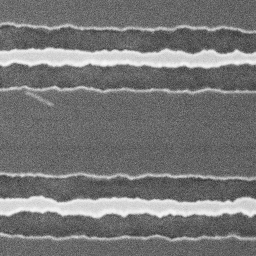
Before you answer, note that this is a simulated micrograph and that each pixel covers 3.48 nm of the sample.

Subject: lines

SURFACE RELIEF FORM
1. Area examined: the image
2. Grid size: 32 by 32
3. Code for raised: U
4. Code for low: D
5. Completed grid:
UUUUUUUUUUUUUUUUUUUUUUUUUUUUUUUU
UUUUUUUUUUUUUUUUUUUUUUUUUUUUUUUU
UUUUUUUUUUUUUUUUUUUUUUUUUUUUUUUU
DDDDDDUDDUUUUUUUUUUUUUDDUUUUUUUU
DDDDDDDDDDDDDDDDDDDDDDDDDDDDDDDD
DDDDDDDDDDDDDDDDDDDDDDDDDDDDDDDD
UUUUUUUUUUUDUUUUUDDDUUUDDUUDDUDD
UUUUUUUUUUUUUUUUUUUUUUUUUUUUUUUU
DDDDDDDDDDDDDDDDDDDDDDDDDDDDDDDD
DDDDDDDDDDDDDDDDDDDDDDDDDDDDDDDD
DDDDDDDDDDDDDDDDDDDDDDDDDDDDDDDD
UUUUUUUUUUUUUUUUUUUUUUUUUUUUUUUU
UUUUUUUUUUUUUUUUUUUUUUUUUUUUUUUU
UUUUUUUUUUUUUUUUUUUUUUUUUUUUUUUU
UUUUUUUUUUUUUUUUUUUUUUUUUUUUUUUU
UUUUUUUUUUUUUUUUUUUUUUUUUUUUUUUU
UUUUUUUUUUUUUUUUUUUUUUUUUUUUUUUU
UUUUUUUUUUUUUUUUUUUUUUUUUUUUUUUU
UUUUUUUUUUUUUUUUUUUUUUUUUUUUUUUU
UUUUUUUUUUUUUUUUUUUUUUUUUUUUUUUU
UUUUUUUUUUUUUUUUUUUUUUUUUUUUUUUU
UUUUUUUUUUUUUUUUUUUUUUUUUUUUUUUU
DDDDDDDDDDDDDDDDDDDDDDDDDDDDDDDD
DDDDDDDDDDDDDDDDDDDDDDDDDDDDDDDD
DDDDDDDDDDDDDDDDDDDDDDDDDDDDDDDD
UUUUUUUUUUUUUUUUUUUUUUUUUUUUUUUU
UUDDDDDUUUUUUUUUUUUUUUUUUUUUUUUU
DDDDDDDDDDDDDDDDDDDDDDDDDDDDDDDD
DDDDDDDDDDDDDDDDDDDDDDDDDDDDDDDD
UUUDDDDDDDDDDDDDDDDUDDDDDDDDDDDD
UUUUUUUUUUUUUUUUUUUUUUUUUUUUUUUU
UUUUUUUUUUUUUUUUUUUUUUUUUUUUUUUU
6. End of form